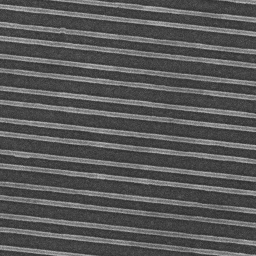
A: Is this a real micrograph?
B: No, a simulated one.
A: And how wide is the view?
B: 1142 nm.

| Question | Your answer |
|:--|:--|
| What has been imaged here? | parallel lines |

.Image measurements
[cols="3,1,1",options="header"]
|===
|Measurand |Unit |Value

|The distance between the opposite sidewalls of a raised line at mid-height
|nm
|16.6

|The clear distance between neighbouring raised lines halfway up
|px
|10.9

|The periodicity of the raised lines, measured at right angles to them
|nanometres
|70.5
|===